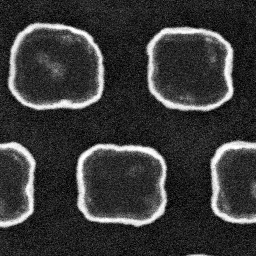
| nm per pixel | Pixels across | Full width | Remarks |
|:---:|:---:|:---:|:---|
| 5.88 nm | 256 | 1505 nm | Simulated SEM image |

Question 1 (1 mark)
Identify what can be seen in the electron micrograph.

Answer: raised bodies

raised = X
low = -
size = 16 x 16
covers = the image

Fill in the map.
----------------
----------------
-XXXXX----XXXX--
-XXXXX---XXXXX--
-XXXXX---XXXXX--
-XXXXX---XXXXX--
--XXX------XXX--
----------------
----------------
XX---XXXXX----XX
XX---XXXXX---XXX
XX---XXXXX---XXX
XX---XXXXX---XXX
XX---XXXXX----XX
----------------
----------------